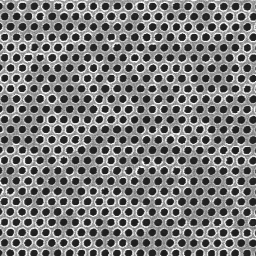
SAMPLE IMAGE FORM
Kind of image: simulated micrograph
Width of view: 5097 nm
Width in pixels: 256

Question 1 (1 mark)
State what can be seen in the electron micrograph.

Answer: a regular array of holes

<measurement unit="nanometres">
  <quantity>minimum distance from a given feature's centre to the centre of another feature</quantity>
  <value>228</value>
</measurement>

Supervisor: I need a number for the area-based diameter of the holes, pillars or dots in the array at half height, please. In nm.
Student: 152